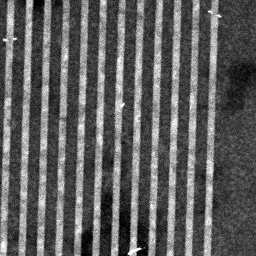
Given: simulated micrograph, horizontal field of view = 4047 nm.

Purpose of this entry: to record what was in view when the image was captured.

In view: parallel lines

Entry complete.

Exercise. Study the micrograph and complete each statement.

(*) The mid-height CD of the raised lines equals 92.9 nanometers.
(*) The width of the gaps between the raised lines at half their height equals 196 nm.